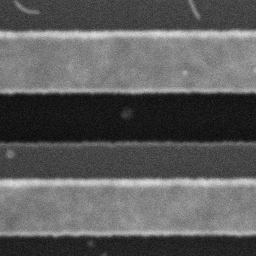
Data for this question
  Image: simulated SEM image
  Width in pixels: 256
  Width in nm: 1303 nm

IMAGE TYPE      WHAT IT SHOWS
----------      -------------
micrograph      lines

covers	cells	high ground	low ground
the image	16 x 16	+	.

++++++++++++++++
++++++++++++++++
++++++++++++++++
++++++++++++++++
++++++++++++++++
++++++++++++++++
................
................
................
++++++++++++++++
++++++++++++++++
++++++++++++++++
++++++++++++++++
++++++++++++++++
++++++++++++++++
................